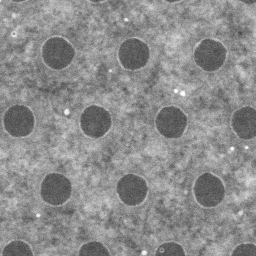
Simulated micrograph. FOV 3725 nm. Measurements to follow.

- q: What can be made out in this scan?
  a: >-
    a regular array of raised bodies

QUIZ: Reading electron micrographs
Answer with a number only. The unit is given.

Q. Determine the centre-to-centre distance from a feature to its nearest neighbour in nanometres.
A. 1110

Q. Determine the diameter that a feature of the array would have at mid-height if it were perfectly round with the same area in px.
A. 34